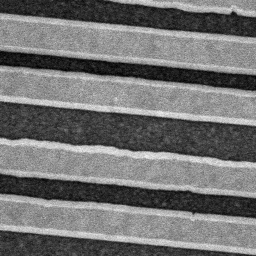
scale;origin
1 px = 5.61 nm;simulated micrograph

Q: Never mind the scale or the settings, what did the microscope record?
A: one or a few lines or trenches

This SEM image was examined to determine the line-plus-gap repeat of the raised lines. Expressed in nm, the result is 335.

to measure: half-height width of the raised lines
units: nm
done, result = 170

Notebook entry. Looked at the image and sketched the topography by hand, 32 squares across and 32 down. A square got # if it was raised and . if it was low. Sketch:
...................#############
..............................##
#####...........................
###############.................
#########################.......
################################
.....###########################
................################
..........................######
###########.....................
#####################...........
#############################...
...#############################
............####################
......................##########
................................
................................
................................
#########.......................
#####################...........
#############################...
.###############################
...........#####################
......................##########
................................
########........................
####################............
##############################..
.###############################
............####################
......................##########
................................